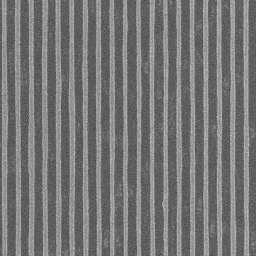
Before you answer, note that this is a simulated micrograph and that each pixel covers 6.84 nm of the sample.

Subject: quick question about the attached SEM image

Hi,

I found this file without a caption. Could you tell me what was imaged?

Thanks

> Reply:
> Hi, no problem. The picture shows parallel lines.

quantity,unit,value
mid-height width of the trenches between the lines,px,8.76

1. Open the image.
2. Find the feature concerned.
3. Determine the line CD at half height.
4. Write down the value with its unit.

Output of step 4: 0.0325 um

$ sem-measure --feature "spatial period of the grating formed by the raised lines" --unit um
0.092